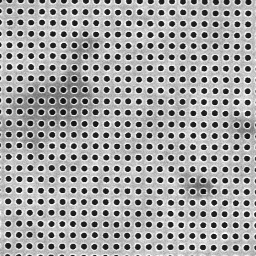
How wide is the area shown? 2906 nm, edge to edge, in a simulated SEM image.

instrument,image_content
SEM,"a regular array of holes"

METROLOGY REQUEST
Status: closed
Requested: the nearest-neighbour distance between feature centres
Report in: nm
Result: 121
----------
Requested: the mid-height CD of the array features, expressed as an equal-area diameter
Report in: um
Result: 0.0678